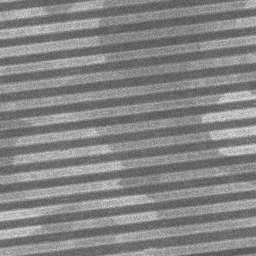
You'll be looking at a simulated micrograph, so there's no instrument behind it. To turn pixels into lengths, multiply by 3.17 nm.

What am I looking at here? parallel lines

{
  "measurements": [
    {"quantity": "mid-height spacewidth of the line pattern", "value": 29.1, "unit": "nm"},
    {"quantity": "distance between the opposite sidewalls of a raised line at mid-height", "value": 0.0291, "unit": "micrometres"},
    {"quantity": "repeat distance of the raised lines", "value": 57.4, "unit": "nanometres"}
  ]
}